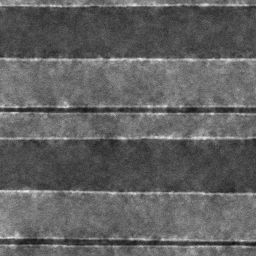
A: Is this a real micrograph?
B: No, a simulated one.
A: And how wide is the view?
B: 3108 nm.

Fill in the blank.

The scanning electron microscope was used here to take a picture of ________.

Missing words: lines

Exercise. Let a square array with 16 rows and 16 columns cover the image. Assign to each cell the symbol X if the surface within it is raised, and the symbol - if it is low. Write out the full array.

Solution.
----------------
----------------
----------------
----------------
XXXXXXXXXXXXXXXX
XXXXXXXXXXXXXXXX
XXXXXXXXXXXXXXXX
XXXXXXXXXXXXXXXX
XXXXXXXXXXXXXXXX
----------------
----------------
----------------
XXXXXXXXXXXXXXXX
XXXXXXXXXXXXXXXX
XXXXXXXXXXXXXXXX
XXXXXXXXXXXXXXXX